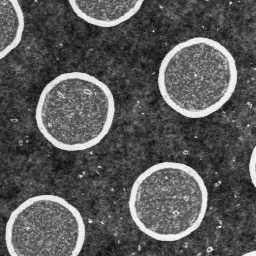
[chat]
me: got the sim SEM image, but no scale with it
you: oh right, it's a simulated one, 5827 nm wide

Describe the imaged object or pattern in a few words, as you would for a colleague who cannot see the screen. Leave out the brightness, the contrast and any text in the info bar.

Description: raised bodies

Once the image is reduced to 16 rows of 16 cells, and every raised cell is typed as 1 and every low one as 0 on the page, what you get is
1000011100000000
1000000000000000
1000000000000000
0000000000011100
0000000000111110
0001110000111100
0001111000011100
0011111000000000
0001110000000000
0000000000000000
0000000000110000
0000000001111000
0011000011111000
0111100011111000
0111100001110000
0111100000000000